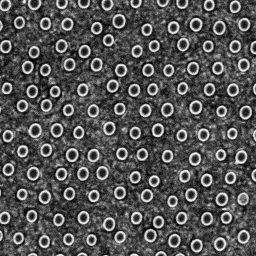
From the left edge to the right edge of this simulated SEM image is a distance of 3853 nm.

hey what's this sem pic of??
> a regular array of raised bodies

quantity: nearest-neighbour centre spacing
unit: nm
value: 321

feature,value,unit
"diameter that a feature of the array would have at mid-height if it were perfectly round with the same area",168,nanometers